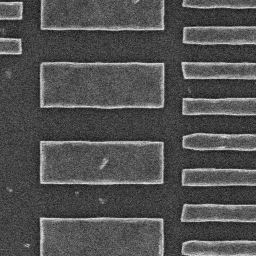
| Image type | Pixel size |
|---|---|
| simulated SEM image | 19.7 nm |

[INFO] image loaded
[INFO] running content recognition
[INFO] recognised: wiring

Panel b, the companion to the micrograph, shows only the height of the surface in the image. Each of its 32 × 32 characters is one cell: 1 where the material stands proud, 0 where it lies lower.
11100111111111111111000111111111
11100111111111111111000000000000
00000111111111111111000000000000
00000111111111111111000111111111
00000000000000000000000111111111
11100000000000000000000000000000
11000000000000000000000000000000
00000000000000000000000000000000
00000111111111111111000111111111
00000111111111111111000111111111
00000111111111111111000000000000
00000111111111111111000000000000
00000111111111111111000111111111
00000000000000000000000111111111
00000000000000000000000000000000
00000000000000000000000000000000
00000000000000000000000000000000
00000000000000000000000111111111
00000111111111111111000111111111
00000111111111111111000000000000
00000111111111111111000000000000
00000111111111111111000111111111
00000111111111111111000111111111
00000000000000000000000000000000
00000000000000000000000000000000
00000000000000000000000000000000
00000000000000000000000111111111
00000111111111111111000111111111
00000111111111111111000000000000
00000111111111111111000000000000
00000111111111111111000111111111
00000111111111111111000111111111